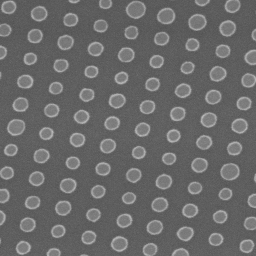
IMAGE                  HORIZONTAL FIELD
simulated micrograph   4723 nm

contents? a regular array of raised bodies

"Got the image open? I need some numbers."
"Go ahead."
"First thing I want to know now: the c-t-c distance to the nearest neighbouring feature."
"0.427 µm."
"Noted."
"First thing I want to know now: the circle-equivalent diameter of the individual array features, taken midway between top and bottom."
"240 nm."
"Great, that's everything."